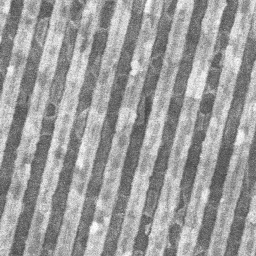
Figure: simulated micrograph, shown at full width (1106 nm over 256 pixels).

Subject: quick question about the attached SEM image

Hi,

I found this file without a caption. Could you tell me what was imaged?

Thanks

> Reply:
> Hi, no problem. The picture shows parallel lines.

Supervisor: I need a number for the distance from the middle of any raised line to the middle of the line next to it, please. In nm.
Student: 129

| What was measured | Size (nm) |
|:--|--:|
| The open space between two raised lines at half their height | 69.8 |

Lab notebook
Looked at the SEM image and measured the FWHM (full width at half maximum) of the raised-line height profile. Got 58.7 nanometres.